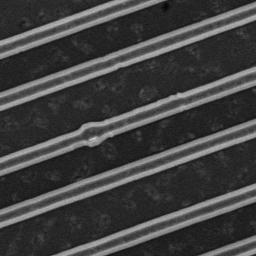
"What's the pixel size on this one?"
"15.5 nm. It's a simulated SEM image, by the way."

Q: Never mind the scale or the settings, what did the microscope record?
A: parallel lines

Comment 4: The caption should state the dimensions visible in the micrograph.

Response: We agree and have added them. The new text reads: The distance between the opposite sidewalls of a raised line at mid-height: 208 nanometres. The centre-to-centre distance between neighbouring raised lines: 854 nanometres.